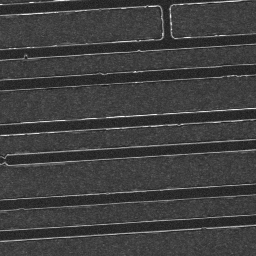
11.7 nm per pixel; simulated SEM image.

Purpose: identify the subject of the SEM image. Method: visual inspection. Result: parallel lines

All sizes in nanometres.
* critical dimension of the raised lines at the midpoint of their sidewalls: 126